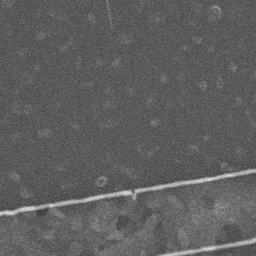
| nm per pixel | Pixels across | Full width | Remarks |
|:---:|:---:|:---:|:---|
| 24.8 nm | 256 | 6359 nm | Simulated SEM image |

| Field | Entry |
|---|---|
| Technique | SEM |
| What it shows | one or a few lines or trenches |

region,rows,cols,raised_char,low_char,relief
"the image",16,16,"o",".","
................
................
................
................
................
................
................
................
................
................
................
...........ooooo
.....ooooooooooo
oooooooooooooooo
oooooooooooooooo
ooooooooooooo...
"